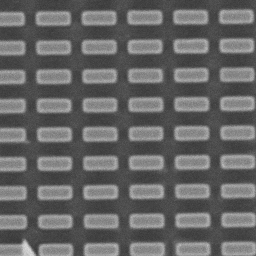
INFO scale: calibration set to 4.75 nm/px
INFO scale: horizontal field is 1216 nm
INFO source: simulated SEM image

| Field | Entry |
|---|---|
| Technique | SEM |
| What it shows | groups of lines, slits or small figures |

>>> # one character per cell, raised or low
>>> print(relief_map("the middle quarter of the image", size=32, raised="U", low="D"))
DDDDDDDDDDDDDDDDDDDDDDDDDDDDDDDD
DDDDDDDDDUUUDDDDDUUUUUUUDDDDUUUU
UUDDDUUUUUUUUDDDUUUUUUUUUDDDUUUU
UUDDDUUUUUUUUDDDUUUUUUUUUDDDUUUU
UUDDDUUUUUUUUDDDDUUUUUUUDDDDDDDD
DDDDDDDDDDDDDDDDDDDDDDDDDDDDDDDD
DDDDDDDDDDDDDDDDDDDDDDDDDDDDDDDD
DDDDDDDDDDDDDDDDDDDDDDDDDDDDDDDD
DDDDDDDDDDDDDDDDDDDDDDDDDDDDUUUU
UUDDDUUUUUUUUDDDUUUUUUUUUDDDUUUU
UUDDDUUUUUUUUDDDUUUUUUUUUDDDUUUU
UUDDDUUUUUUUUDDDUUUUUUUUUDDDUUUU
DDDDDDDDDDDDDDDDDDDDDDDDDDDDDDDD
DDDDDDDDDDDDDDDDDDDDDDDDDDDDDDDD
DDDDDDDDDDDDDDDDDDDDDDDDDDDDDDDD
DDDDDDDDDDDDDDDDDDDDDDDDDDDDDDDD
UUDDDUUUUUUUUDDDUUUUUUUUUDDDUUUU
UUDDDUUUUUUUUDDDUUUUUUUUUDDDUUUU
UUDDDUUUUUUUUDDDUUUUUUUUUDDDUUUU
DDDDDDDDDDDDDDDDDDDDDDDDDDDDDDDD
DDDDDDDDDDDDDDDDDDDDDDDDDDDDDDDD
DDDDDDDDDDDDDDDDDDDDDDDDDDDDDDDD
DDDDDDDDDDDDDDDDDDDDDDDDDDDDDDDD
UUDDDUUUUUUUUDDDDUUUUUUUUDDDUUUU
UUDDDUUUUUUUUDDDUUUUUUUUUDDDUUUU
UUDDDUUUUUUUUDDDUUUUUUUUUDDDUUUU
UDDDDDDDDDDDDDDDDDDDDDDDDDDDDDDD
DDDDDDDDDDDDDDDDDDDDDDDDDDDDDDDD
DDDDDDDDDDDDDDDDDDDDDDDDDDDDDDDD
DDDDDDDDDDDDDDDDDDDDDDDDDDDDDDDD
UDDDDUUUUUUUUDDDDUUUUUUUUDDDUUUU
UUDDDUUUUUUUUDDDDUUUUUUUUDDDUUUU